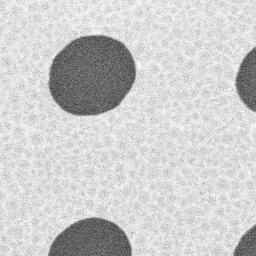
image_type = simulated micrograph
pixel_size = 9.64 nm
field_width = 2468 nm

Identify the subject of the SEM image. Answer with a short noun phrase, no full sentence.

holes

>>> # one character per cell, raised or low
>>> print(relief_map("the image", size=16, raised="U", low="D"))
UUUUUUUUUUUUUUUU
UUUUUUUUUUUUUUUU
UUUUUDDUUUUUUUUU
UUUUDDDDUUUUUUUD
UUUDDDDDDUUUUUUD
UUUDDDDDUUUUUUUD
UUUUDDDUUUUUUUUD
UUUUUUUUUUUUUUUU
UUUUUUUUUUUUUUUU
UUUUUUUUUUUUUUUU
UUUUUUUUUUUUUUUU
UUUUUUUUUUUUUUUU
UUUUUUUUUUUUUUUU
UUUUUUUUUUUUUUUU
UUUUDDDDUUUUUUUD
UUUDDDDDUUUUUUUD